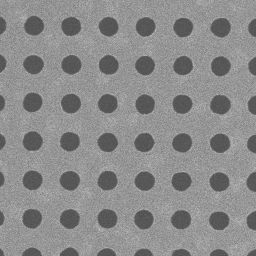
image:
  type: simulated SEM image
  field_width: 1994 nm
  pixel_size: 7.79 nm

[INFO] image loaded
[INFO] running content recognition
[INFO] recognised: a regular array of holes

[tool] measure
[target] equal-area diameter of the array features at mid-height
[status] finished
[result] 155 nanometers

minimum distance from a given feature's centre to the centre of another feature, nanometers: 291